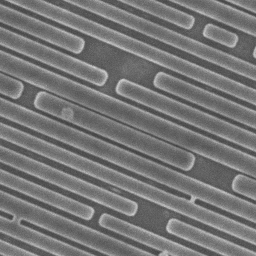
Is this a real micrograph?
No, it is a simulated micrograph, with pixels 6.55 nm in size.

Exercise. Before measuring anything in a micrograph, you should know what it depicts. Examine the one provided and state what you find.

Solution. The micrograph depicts parallel lines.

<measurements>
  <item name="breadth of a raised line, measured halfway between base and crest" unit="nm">96.7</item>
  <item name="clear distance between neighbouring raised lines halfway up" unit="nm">42.3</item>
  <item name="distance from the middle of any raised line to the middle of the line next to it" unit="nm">141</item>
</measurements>